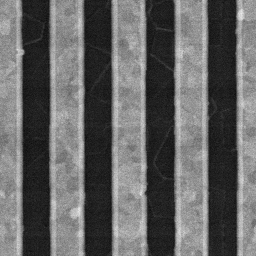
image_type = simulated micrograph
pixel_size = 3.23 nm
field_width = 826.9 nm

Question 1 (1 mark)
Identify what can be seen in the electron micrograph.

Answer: one or a few lines or trenches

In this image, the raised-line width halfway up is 87.9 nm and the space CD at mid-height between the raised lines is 111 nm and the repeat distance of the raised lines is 201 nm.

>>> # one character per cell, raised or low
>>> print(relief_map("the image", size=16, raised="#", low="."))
#..##..##..##..#
#..##..##..##..#
#..##..##..##..#
#..##..##..##..#
#..##..##..##..#
#..##..##..##..#
#..##..##..##..#
#..##..##..##..#
#..##..##..##..#
#..##..##..##..#
#..##..##..##..#
#..##..##..##..#
#..##..##..##..#
#..##..##..##..#
#..##..##..##..#
#..##..##..##..#